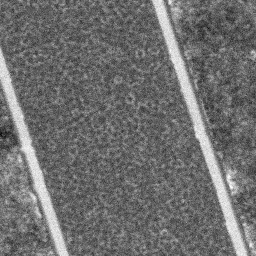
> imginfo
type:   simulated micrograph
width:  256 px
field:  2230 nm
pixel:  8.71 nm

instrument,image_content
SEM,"one or a few lines or trenches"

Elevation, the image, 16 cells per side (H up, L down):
HHHHHHHHHHLLLLLL
HHHHHHHHHHLLLLLL
HHHHHHHHHHHLLLLL
HHHHHHHHHHHLLLLL
HHHHHHHHHHHLLLLL
LHHHHHHHHHHHLLLL
LHHHHHHHHHHHLLLL
LHHHHHHHHHHHLLLL
LLHHHHHHHHHHHLLL
LLHHHHHHHHHHHLLL
LLHHHHHHHHHHHLLL
LLHHHHHHHHHHHHLL
LLLHHHHHHHHHHHLL
LLLHHHHHHHHHHHLL
LLLLHHHHHHHHHHHL
LLLLHHHHHHHHHHHL